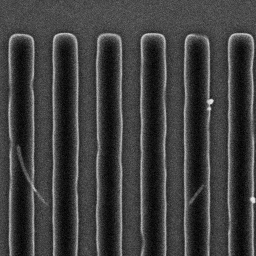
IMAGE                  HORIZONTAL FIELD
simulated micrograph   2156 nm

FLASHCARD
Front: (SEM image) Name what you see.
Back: groups of lines, slits or small figures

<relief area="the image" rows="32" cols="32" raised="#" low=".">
................................
................................
................................
................................
..##...##....##...##....#....##.
.###...###..###...###..###...###
.###...###..###...###..###...###
.###...###..###...###..###...###
.###...###..###...###..###...###
.###...###..###...###..###...###
.###...###..###...###..###...###
.###...###..###...###..###...###
.###...###..###...###..###...###
.###...###..###...###..###...###
.###...###..###...###..###...###
.###...###..###...###..###...###
.###...###..###...###..###...###
.###...###..###...###..###...###
.###...###..###...###..###...###
.###...###..###...###..###...###
.###...###..###...###..###...###
.###...###..###...###..###...###
.###...###..###...###..###...###
.###...##...###...###..###...###
.###...###..###...###..###...###
.###...###..###...###..###...###
.###...###..###...###..###...###
.###...###..###...###..###...###
.###...###..###...###..###...###
.###...###..###...###..###...###
.###...###..###...###..###...###
.###...###..###...###..###...###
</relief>